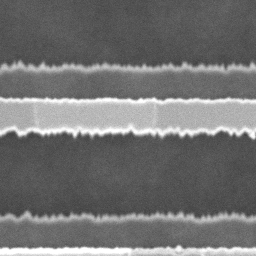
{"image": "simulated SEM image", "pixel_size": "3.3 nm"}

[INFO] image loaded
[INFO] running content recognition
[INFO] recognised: lines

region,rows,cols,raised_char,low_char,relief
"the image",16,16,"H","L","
LLLLLLLLLLLLLLLL
LLLLLLLLLLLLLLLL
LLLLLLLLLLLLLLLL
LLLLLLLLLLLLLLLL
HHHHHHHHHHHHHHHH
HHHHHHHHHHHHHHHH
HHHHHHHHHHHHHHHH
HHHHHHHHHHHHHHHH
LLLLLLLLLLLLLLLL
LLLLLLLLLLLLLLLL
LLLLLLLLLLLLLLLL
LLLLLLLLLLLLLLLL
LLLLLLLLLLLLLLLL
LLLLLLLLHLLLLLHL
HHHHHHHHHHHHHHHH
HHHHHHHHHHHHHHHH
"